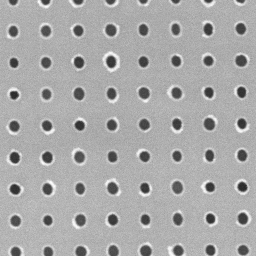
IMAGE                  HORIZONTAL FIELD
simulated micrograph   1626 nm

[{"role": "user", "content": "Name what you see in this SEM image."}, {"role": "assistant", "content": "a regular array of holes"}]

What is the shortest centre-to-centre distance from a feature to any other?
0.2 micrometres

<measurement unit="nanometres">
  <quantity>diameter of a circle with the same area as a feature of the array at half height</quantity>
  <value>71.8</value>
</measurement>